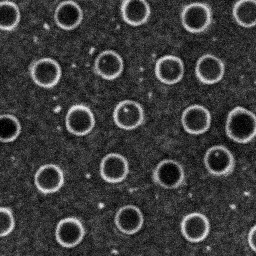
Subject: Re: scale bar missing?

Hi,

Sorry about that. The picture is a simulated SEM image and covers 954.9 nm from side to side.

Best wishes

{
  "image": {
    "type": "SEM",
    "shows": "a regular array of raised bodies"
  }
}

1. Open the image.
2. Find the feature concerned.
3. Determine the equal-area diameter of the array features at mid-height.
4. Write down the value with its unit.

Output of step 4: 101 nm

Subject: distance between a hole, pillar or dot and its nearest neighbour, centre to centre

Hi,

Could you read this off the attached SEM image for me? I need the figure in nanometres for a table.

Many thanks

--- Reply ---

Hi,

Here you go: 200